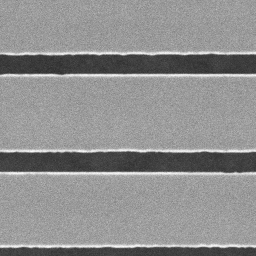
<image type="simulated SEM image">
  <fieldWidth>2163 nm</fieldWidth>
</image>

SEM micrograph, lines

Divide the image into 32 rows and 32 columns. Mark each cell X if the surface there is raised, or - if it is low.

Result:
XXXXXXXXXXXXXXXXXXXXXXXXXXXXXXXX
XXXXXXXXXXXXXXXXXXXXXXXXXXXXXXXX
XXXXXXXXXXXXXXXXXXXXXXXXXXXXXXXX
XXXXXXXXXXXXXXXXXXXXXXXXXXXXXXXX
XXXXXXXXXXXXXXXXXXXXXXXXXXXXXXXX
XXXXXXXXXXXXXXXXXXXXXXXXXXXXXXXX
XXXXXXXXXXXXXXXXXXXXXXXXXXXXXXXX
--------------------------------
--------------------------------
XXXXXXXXXXXXXXXXXXXXXXXXXXXXXXXX
XXXXXXXXXXXXXXXXXXXXXXXXXXXXXXXX
XXXXXXXXXXXXXXXXXXXXXXXXXXXXXXXX
XXXXXXXXXXXXXXXXXXXXXXXXXXXXXXXX
XXXXXXXXXXXXXXXXXXXXXXXXXXXXXXXX
XXXXXXXXXXXXXXXXXXXXXXXXXXXXXXXX
XXXXXXXXXXXXXXXXXXXXXXXXXXXXXXXX
XXXXXXXXXXXXXXXXXXXXXXXXXXXXXXXX
XXXXXXXXXXXXXXXXXXXXXXXXXXXXXXXX
XXXXXXXXXXXXXXXXXXXXXXXXXXXXXXXX
--------------------------------
--------------------------------
--------------------------------
XXXXXXXXXXXXXXXXXXXXXXXXXXXXXXXX
XXXXXXXXXXXXXXXXXXXXXXXXXXXXXXXX
XXXXXXXXXXXXXXXXXXXXXXXXXXXXXXXX
XXXXXXXXXXXXXXXXXXXXXXXXXXXXXXXX
XXXXXXXXXXXXXXXXXXXXXXXXXXXXXXXX
XXXXXXXXXXXXXXXXXXXXXXXXXXXXXXXX
XXXXXXXXXXXXXXXXXXXXXXXXXXXXXXXX
XXXXXXXXXXXXXXXXXXXXXXXXXXXXXXXX
XXXXXXXXXXXXXXXXXXXXXXXXXXXXXXXX
--------------------------------